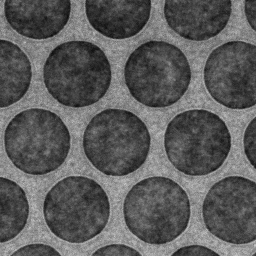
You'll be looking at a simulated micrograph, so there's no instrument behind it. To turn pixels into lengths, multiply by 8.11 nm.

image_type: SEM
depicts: holes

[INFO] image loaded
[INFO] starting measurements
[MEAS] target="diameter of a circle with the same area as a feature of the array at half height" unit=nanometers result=551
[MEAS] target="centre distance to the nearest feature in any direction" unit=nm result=637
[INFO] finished